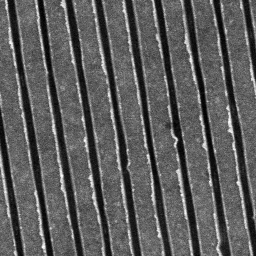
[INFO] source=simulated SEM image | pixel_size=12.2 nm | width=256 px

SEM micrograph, parallel lines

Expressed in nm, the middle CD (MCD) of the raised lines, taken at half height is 263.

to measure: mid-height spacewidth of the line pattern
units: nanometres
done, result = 94.6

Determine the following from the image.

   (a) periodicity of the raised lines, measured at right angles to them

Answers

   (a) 354 nm